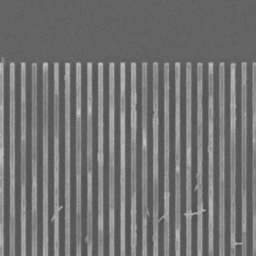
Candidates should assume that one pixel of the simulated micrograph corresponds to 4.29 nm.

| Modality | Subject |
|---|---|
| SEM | parallel lines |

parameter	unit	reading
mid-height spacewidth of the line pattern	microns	0.0327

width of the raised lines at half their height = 16.1 nanometres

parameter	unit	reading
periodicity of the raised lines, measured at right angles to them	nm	47.4